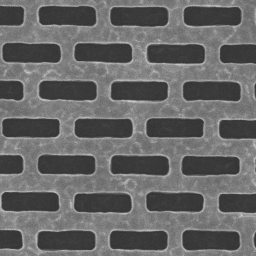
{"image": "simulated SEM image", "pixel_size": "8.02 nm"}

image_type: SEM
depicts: a regular array of holes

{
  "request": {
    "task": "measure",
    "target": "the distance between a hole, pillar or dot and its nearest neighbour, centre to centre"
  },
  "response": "413 nanometres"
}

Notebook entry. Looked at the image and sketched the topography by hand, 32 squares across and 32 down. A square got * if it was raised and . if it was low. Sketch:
********************************
...**.......**.......**.......**
...**.......**.......**.......**
********************************
********************************
*......***..**..***..*********..
........*........*........*.....
*......***......***......***....
********************************
********************************
...**.......**.......**.......**
...**.......**.......**.......**
*********..****......**.......**
********************************
********************************
.......**........*.......**.....
.......**........*.......**.....
********************************
********************************
..***......***..*...***......***
...**.......**.......**.......**
...**.......**.......**.......**
********************************
********************************
.......***......**.......***....
.......**.......**.......**.....
**********......************....
********************************
********************************
...**.......**.......**.......**
...**.......**.......**.......**
********************************